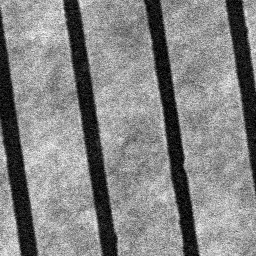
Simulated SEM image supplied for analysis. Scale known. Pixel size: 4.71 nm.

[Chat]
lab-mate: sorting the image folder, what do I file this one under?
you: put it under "one or a few lines or trenches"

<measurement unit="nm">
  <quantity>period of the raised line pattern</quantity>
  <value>377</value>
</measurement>